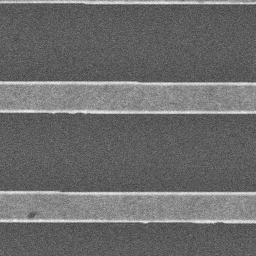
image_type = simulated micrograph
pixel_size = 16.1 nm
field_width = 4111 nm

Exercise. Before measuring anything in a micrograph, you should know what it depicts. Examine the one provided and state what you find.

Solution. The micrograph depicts lines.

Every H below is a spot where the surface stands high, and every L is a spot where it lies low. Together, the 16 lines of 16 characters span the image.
LLLLLLLLLLLLLLLL
LLLLLLLLLLLLLLLL
LLLLLLLLLLLLLLLL
LLLLLLLLLLLLLLLL
LLLLLLLLLLLLLLLL
HHHHHHHHHHHHHHHH
HHHHHHHHHHHHHHHH
LLLLLLLLLLLLLLLL
LLLLLLLLLLLLLLLL
LLLLLLLLLLLLLLLL
LLLLLLLLLLLLLLLL
LLLLLLLLLLLLLLLL
HHHHHHHHHHHHHHHH
HHHHHHHHHHHHHHHH
LLLLLLLLLLLLLLLL
LLLLLLLLLLLLLLLL